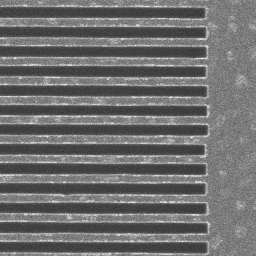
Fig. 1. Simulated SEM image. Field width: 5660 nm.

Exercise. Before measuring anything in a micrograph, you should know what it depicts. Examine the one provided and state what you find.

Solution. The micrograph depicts parallel lines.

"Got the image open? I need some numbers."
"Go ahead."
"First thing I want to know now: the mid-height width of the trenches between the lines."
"204 nanometers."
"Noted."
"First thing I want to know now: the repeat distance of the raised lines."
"432 nm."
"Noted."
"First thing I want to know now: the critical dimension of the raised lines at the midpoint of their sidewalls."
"224 nm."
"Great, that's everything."